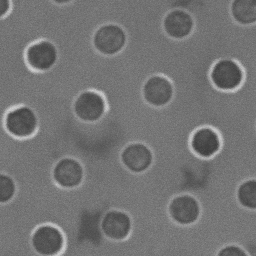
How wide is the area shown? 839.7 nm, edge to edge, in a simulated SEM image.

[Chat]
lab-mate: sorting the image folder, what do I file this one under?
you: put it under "a regular array of holes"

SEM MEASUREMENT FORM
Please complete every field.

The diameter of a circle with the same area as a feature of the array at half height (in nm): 95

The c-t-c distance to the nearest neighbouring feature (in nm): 229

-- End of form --